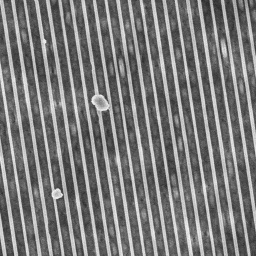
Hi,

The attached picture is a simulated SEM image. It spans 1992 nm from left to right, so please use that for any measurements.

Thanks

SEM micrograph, parallel lines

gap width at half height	0.0674	µm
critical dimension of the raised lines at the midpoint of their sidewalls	3.47	pixels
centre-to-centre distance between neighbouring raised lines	0.0896	µm